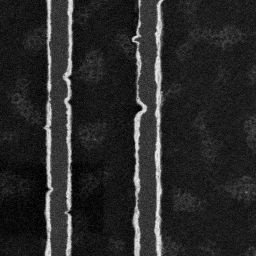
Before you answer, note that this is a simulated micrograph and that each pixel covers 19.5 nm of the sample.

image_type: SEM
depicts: one or a few lines or trenches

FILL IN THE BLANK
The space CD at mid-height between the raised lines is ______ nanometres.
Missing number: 1330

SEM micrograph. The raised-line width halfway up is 402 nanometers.